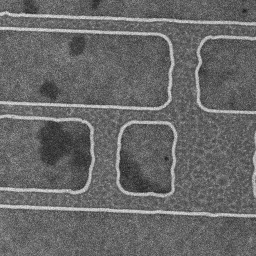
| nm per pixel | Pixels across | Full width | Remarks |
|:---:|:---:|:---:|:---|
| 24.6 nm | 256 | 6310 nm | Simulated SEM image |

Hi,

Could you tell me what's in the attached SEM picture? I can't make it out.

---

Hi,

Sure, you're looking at one or a few lines or trenches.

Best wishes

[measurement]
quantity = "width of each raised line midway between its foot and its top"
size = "354 nm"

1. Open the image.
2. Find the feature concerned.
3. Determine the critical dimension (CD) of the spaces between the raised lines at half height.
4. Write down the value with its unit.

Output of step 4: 1830 nm